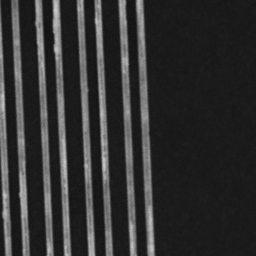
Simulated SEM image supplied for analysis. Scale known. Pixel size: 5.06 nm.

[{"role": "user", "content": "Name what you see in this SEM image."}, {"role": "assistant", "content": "parallel lines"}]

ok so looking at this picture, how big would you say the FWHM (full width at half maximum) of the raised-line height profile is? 31 nanometers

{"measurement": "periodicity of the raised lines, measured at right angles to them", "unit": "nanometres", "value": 104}